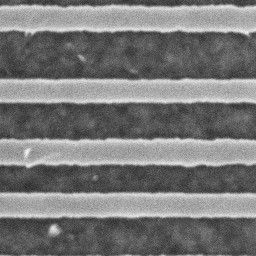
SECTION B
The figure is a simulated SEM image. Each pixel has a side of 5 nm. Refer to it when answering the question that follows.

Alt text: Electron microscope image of lines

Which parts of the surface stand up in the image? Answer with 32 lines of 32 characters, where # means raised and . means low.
................................
################################
################################
################################
................................
................................
................................
................................
................................
................................
################################
################################
################################
................................
................................
................................
................................
##.###.......##..#.#####...##...
################################
################################
#####.#######..#############...#
................................
................................
................................
################################
################################
################################
................................
......#.........................
................................
................................
................................